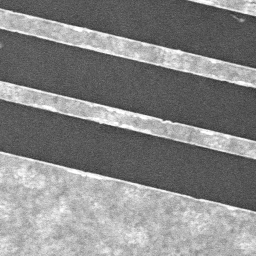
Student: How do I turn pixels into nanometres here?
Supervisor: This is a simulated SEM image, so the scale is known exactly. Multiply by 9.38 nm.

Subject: one or a few lines or trenches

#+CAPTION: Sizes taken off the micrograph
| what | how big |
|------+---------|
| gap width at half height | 495 nanometers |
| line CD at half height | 164 nm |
